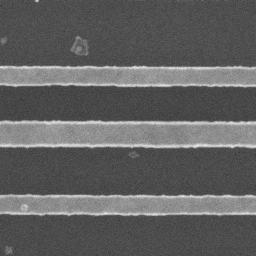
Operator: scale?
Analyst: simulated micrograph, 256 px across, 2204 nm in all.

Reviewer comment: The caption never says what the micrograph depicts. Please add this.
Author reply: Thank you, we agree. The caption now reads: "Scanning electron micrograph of lines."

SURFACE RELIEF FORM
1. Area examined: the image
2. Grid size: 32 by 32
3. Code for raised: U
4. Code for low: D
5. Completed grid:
DDDDDDDDDDDDDDDDDDDDDDDDDDDDDDDD
DDDDDDDDDDDDDDDDDDDDDDDDDDDDDDDD
DDDDDDDDDDDDDDDDDDDDDDDDDDDDDDDD
DDDDDDDDDDDDDDDDDDDDDDDDDDDDDDDD
DDDDDDDDDDDDDDDDDDDDDDDDDDDDDDDD
DDDDDDDDDDDDDDDDDDDDDDDDDDDDDDDD
DDDDDDDDDDDDDDDDDDDDDDDDDDDDDDDD
DDDDDDDDDDDDDDDDDDDDDDDDDDDDDDDD
UUUUUUUUUUUUUUUUUUUUUUUUUUUUUUUU
UUUUUUUUUUUUUUUUUUUUUUUUUUUUUUUU
UUUUUUUUUUUUUUUUUUUUUUUUUUUUUUUU
DDDDDDDDDDDDDDDDDDDDDDDDDDDDDDDD
DDDDDDDDDDDDDDDDDDDDDDDDDDDDDDDD
DDDDDDDDDDDDDDDDDDDDDDDDDDDDDDDD
DDDDDDDDDDDDDDDDDDDDDDDDDDDDDDDD
UUUUUUUUUUUUUUUUUUUUUUUUUUUUUUUU
UUUUUUUUUUUUUUUUUUUUUUUUUUUUUUUU
UUUUUUUUUUUUUUUUUUUUUUUUUUUUUUUU
DDDDDDDDDDDDDDDDDDDDDDDDDDDDDDDD
DDDDDDDDDDDDDDDDDDDDDDDDDDDDDDDD
DDDDDDDDDDDDDDDDDDDDDDDDDDDDDDDD
DDDDDDDDDDDDDDDDDDDDDDDDDDDDDDDD
DDDDDDDDDDDDDDDDDDDDDDDDDDDDDDDD
DDDDDDDDDDDDDDDDDDDDDDDDDDDDDDDD
UUUUUUUUUUUUDUUUUUUUUDUUDUUUUDUU
UUUUUUUUUUUUUUUUUUUUUUUUUUUUUUUU
UUUUUUUUUUUUUUUUUUUUUUUUUUUUUUUU
DDDDDDDDDDDDDDDDDDDDDDDDDDDDDDDD
DDDDDDDDDDDDDDDDDDDDDDDDDDDDDDDD
DDDDDDDDDDDDDDDDDDDDDDDDDDDDDDDD
DDDDDDDDDDDDDDDDDDDDDDDDDDDDDDDD
DDDDDDDDDDDDDDDDDDDDDDDDDDDDDDDD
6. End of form